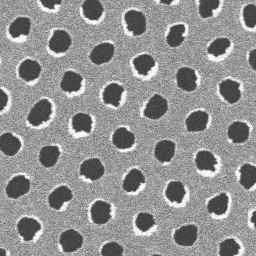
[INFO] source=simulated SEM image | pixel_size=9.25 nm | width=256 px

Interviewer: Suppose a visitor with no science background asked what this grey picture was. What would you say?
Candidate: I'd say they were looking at a regular array of holes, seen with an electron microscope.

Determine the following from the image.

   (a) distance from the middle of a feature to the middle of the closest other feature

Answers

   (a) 392 nm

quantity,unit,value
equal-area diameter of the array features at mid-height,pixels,22.1